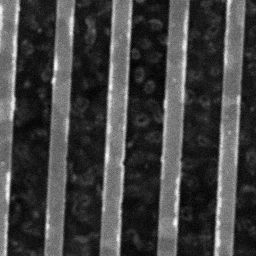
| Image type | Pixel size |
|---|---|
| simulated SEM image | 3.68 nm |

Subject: parallel lines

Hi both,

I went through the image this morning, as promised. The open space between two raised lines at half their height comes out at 143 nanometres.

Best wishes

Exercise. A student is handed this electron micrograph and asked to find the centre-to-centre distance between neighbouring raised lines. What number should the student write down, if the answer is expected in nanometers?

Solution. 209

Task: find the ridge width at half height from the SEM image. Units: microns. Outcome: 0.0662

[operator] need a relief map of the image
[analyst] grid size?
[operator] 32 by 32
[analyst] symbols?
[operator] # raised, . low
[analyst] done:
##.....##.....##.....##.....###.
##.....##.....##.....##.....###.
##.....##.....##.....##.....##..
##.....##.....##.....##.....##..
##.....##.....##.....##.....##..
##.....##.....##.....##.....##..
##.....##.....##.....##.....##..
##.....##.....##.....##.....##..
##.....##.....##.....##.....##..
##.....##.....##.....##.....##..
##.....##.....##.....##.....##..
##.....##.....##.....##.....##..
##.....##.....##.....##.....##..
##.....##.....##.....##.....##..
##....###....###.....##.....##..
##....##.....###.....##.....##..
##....##.....###....###.....##..
#.....##.....###....###.....##..
#.....##.....###....###.....##..
#.....##.....###....##.....###..
#.....##.....##.....##.....###..
#.....##.....##.....##.....###..
#.....##.....##.....##.....##...
#.....##.....##.....##.....##...
#.....##.....##.....##.....##...
#.....##.....##.....##.....##...
#.....##.....##.....##.....##...
#.....##.....##.....##.....##...
#.....##.....##.....##.....##...
#.....##.....##.....##.....##...
#.....##.....##.....##.....##...
#.....##.....##.....##.....##...